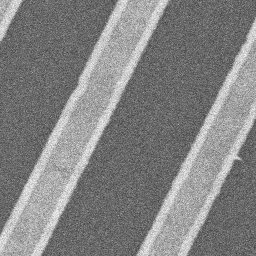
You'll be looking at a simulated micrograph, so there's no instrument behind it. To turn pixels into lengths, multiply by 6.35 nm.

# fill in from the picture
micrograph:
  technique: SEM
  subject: one or a few lines or trenches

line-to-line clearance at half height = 608 nm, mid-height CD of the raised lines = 224 nm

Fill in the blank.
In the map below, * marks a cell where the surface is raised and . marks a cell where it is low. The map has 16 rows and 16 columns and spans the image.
*.......**......
.......**.......
......***.......
......***......*
.....***.......*
.....**.......**
....***.......**
....**.......***
...***.......**.
...**.......***.
..***.......**..
..**.......***..
.***.......**...
.**.......***...
***.......**....
**.......***....